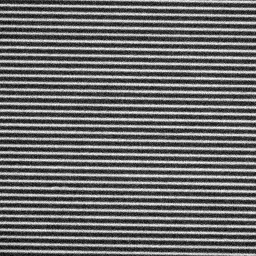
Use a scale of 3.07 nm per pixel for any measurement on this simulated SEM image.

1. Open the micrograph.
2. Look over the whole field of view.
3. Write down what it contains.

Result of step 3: parallel lines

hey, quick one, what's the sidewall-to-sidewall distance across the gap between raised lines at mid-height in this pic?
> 16.5 nm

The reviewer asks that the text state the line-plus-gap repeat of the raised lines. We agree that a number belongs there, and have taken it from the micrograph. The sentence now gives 21.6 nm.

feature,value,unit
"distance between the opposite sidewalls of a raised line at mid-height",5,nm